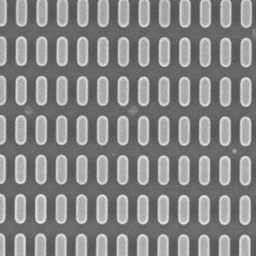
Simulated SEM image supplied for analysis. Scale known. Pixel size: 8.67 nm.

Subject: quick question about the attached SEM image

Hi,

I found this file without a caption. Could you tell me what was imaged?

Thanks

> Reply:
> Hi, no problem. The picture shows groups of lines, slits or small figures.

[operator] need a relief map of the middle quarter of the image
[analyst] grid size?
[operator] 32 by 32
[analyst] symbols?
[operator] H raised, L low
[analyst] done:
LLLLLLLLLLLLLLLLLLLLLLLLLLLLLLHL
LLLLLLLLLLLLLLLLLLLLLLLLLLLLLLLL
LLLLLLLLLLLLLLLLLLLLLLLLLLLLLLLL
LLLLHLLLLHLLLLHHLLLHHLLLHHLLLLHL
HLLHHHLLLHHLLLHHLLLHHLLLHHLLLHHL
HLLHHHLLHHHLLLHHLLLHHLLLHHLLLHHL
HLLHHHLLHHHLLLHHLLLHHLLLHHLLLHHL
HLLHHHLLHHHLLLHHLLLHHLLLHHLLLHHL
HLLHHHLLHHHLLLHHLLLHHLLLHHLLLHHL
HLLHHHLLLHHLLLHHLLLHHLLLHHLLLHHL
LLLLLLLLLLLLLLLLLLLLLLLLLLLLLLLL
LLLLLLLLLLLLLLLLLLLLLLLLLLLLLLLL
LLLLLLLLLLLLLLLLLLLLLLLLLLLLLLLL
LLLHHHLLLHHLLLHHLLLHHLLLHHLLLHHL
HLLHHHLLHHHLLLHHLLLHHLLLHHLLLHHL
HLLHHHLLHHHLLLHHLLLHHLLLHHLLLHHL
HLLHHHLLHHHLLLHHLLLHHLLLHHLLLHHL
HLLHHHLLHHHLLLHHLLLHHLLLHHLLLHHL
HLLHHHLLHHHLLLHHLLLHHLLLHHLLLHHL
LLLHHHLLLHHLLLHHLLLHHLLLHHLLLHHL
LLLLLLLLLLLLLLLLLLLLLLLLLLLLLLLL
LLLLLLLLLLLLLLLLLLLLLLLLLLLLLLLL
LLLLLLLLLLLLLLLLLLLLLLLLLLLLLLLL
LLLHHHLLLHHLLLHHLLLHHLLLHHLLLHHL
HLLHHHLLHHHLLLHHLLLHHLLLHHLLLHHL
HLLHHHLLHHHLLLHHLLLHHLLLHHLLLHHL
HLLHHHLLHHHLLLHHLLLHHLLLHHLLLHHL
HLLHHHLLHHHLLLHHLLLHHLLLHHLLLHHL
HLLHHHLLHHHLLLHHLLLHHLLLHHLLLHHL
LLLHHLLLLHHLLLHHLLLHHLLLHHLLLHHL
LLLLLLLLLLLLLLLLLLLLLLLLLLLLLLLL
LLLLLLLLLLLLLLLLLLLLLLLLLLLLLLLL